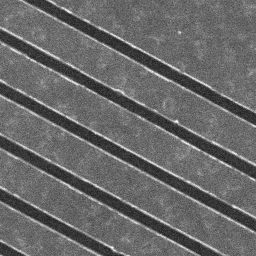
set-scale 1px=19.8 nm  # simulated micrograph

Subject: parallel lines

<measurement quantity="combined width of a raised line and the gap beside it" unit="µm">0.928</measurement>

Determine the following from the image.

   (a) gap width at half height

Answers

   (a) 239 nm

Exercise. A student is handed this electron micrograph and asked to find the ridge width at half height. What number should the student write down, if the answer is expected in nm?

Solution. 695